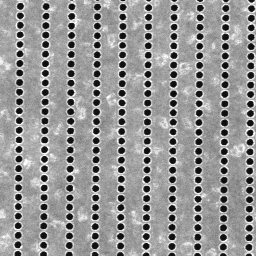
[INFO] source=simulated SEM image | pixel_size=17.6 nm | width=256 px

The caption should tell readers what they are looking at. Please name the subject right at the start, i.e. a regular array of holes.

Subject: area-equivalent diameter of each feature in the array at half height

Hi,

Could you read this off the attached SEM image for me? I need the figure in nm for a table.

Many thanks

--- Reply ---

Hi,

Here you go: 127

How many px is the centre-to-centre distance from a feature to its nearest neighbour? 9.2